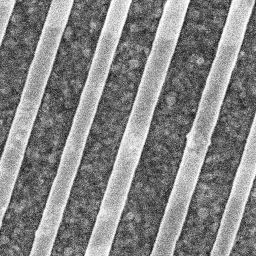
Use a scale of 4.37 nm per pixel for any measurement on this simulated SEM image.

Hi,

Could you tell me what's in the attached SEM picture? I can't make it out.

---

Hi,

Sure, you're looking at parallel lines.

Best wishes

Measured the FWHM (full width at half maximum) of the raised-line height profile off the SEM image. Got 87.3 nanometers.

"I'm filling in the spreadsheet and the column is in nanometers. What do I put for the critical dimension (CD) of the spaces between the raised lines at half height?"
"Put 161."